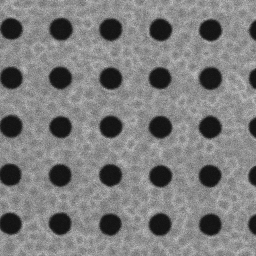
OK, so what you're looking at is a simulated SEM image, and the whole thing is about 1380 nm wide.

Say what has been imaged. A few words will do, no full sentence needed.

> a regular array of holes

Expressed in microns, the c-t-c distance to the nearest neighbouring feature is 0.261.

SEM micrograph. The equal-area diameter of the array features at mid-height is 120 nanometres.